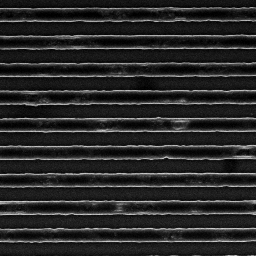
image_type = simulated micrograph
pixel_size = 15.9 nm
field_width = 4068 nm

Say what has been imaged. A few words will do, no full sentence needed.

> parallel lines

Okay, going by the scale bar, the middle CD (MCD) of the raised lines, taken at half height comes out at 0.205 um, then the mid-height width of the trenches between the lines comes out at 232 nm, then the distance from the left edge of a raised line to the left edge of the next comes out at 0.439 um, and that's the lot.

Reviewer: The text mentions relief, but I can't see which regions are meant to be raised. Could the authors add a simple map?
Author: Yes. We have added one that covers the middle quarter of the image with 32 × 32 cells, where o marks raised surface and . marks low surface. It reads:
oooooooooooooooooooooooooooooooo
oooooooooooooooooooooooooooooooo
oooooooooooooooooooooooooooooooo
................................
................................
................................
................................
oooooooooooooooooooooooooooooooo
oooooooooooooooooooooooooooooooo
oooooooooooooooooooooooooooooooo
................................
................................
................................
.......................o........
oooooooooooooooooooooooooooooooo
oooooooooooooooooooooooooooooooo
oooooooooooooooooooooooooooooooo
................................
................................
................................
.....................o...ooooooo
oooooooooooooooooooooooooooooooo
oooooooooooooooooooooooooooooooo
ooooooooooooooooooooooooo..ooooo
................................
................................
................................
....oooo.....oo........o.o.o.ooo
oooooooooooooooooooooooooooooooo
oooooooooooooooooooooooooooooooo
oooooooooooooooooooooooooooooooo
................................